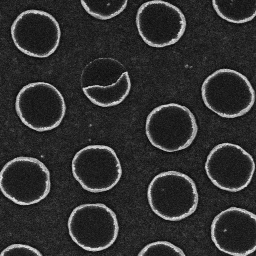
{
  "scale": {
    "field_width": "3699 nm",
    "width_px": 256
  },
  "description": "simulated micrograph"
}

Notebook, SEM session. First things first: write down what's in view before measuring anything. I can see a regular array of raised bodies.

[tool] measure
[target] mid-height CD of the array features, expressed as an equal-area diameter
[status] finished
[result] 689 nm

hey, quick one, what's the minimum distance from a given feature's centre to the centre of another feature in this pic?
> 941 nanometers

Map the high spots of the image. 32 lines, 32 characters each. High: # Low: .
..........######..###......#####
...##......####..#####.....#####
..#####..........######......##.
..#####..........######.........
..#####...........#####.........
..#####............##...........
...####.........................
................................
................................
...............#..........####..
....##........##..........#####.
...####....#####.........#######
..######...####..........#######
..######............###...#####.
...#####...........#####....#...
...####...........######........
..................######........
...................#####........
...........###......###....###..
.........#####............#####.
.####....######...........######
######...######...........######
######....#####....#####..#####.
######.....###.....#####....##..
.#####.............######.......
...#...............######.......
.........#####.....#####....###.
.........#####.............#####
.........######............#####
.........#####.............#####
..........####.....##......#####
#####.............#####.....###.